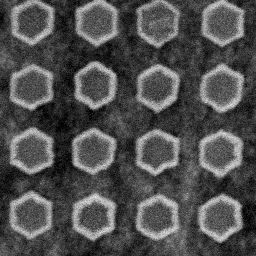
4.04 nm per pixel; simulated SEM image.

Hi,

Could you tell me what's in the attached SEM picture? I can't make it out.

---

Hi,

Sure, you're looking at a regular array of raised bodies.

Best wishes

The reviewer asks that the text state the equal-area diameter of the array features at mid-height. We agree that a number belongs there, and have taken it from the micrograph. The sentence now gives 162 nanometers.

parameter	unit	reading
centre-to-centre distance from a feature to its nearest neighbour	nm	256